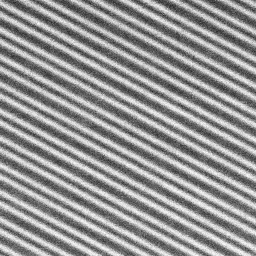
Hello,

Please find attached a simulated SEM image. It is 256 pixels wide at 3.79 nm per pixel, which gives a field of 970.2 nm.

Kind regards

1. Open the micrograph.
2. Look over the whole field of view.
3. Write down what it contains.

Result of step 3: parallel lines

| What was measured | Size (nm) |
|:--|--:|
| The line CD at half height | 11.7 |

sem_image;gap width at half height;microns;0.0301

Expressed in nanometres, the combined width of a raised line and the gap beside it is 45.1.